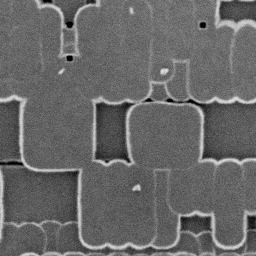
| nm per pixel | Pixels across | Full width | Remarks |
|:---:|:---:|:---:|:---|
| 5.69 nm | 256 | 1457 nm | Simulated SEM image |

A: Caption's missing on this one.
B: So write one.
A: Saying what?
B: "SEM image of wiring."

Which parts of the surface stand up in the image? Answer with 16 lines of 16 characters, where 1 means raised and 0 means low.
1110011111111100
1111111111111111
1111111111111111
1111111111111111
1111111111111111
1111111111111111
0111110011111000
0111110011111000
0111110011111000
0111110011111000
0011111111111111
0000011111111111
0000011111111111
0000011111110111
0000011111100110
0000000101100010